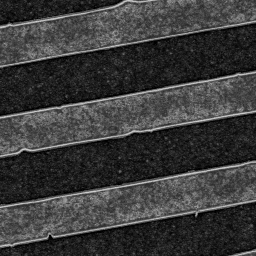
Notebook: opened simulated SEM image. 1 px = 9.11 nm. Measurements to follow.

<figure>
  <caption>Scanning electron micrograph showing one or a few lines or trenches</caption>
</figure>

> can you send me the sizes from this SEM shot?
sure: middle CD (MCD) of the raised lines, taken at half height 0.344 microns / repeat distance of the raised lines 807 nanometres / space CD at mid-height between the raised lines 461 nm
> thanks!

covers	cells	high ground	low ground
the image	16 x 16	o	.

.......ooooooooo
.oooooooooooooo.
ooooooooo.......
oooo............
................
..........oooooo
.....ooooooooooo
ooooooooooooo...
ooooooo.........
o...............
..............oo
.........ooooooo
...ooooooooooooo
ooooooooooo.....
ooooo...........
................